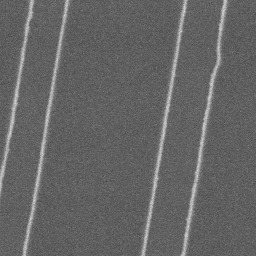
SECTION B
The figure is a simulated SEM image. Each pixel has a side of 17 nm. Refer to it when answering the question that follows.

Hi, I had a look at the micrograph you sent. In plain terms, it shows one or a few lines or trenches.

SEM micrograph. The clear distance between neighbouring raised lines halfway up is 1990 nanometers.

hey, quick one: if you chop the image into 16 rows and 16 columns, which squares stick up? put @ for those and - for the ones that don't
--@@--------@@--
--@@-------@@@--
--@@-------@@@--
-@@@-------@@@--
-@@--------@@---
-@@--------@@---
-@@--------@@---
-@@-------@@@---
-@@-------@@@---
@@@-------@@@---
@@--------@@----
@@--------@@----
@@--------@@----
@@-------@@@----
@@-------@@@----
@@-------@@@----